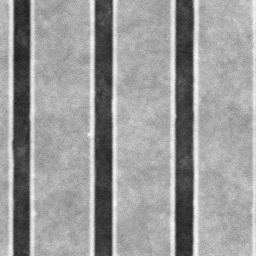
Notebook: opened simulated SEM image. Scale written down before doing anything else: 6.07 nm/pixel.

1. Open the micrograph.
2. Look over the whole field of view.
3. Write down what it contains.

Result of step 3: one or a few lines or trenches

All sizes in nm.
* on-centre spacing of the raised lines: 496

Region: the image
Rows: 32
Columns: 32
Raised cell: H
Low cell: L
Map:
HLLLHHHHHHHLLLHHHHHHHHLLLHHHHHHH
HLLLHHHHHHHLLLHHHHHHHHLLLHHHHHHH
HLLLHHHHHHHLLLHHHHHHHHLLLHHHHHHH
HLLLHHHHHHHLLLHHHHHHHHLLLHHHHHHH
HLLLHHHHHHHLLLHHHHHHHHLLLHHHHHHH
HLLLHHHHHHHLLLHHHHHHHHLLLHHHHHHH
HLLLHHHHHHHLLLHHHHHHHHLLLHHHHHHH
HLLLHHHHHHHLLLHHHHHHHHLLLHHHHHHH
HLLLHHHHHHHLLLHHHHHHHHLLLHHHHHHH
HLLLHHHHHHHLLLHHHHHHHHLLLHHHHHHH
HLLLHHHHHHHLLLHHHHHHHHLLLHHHHHHH
HLLLHHHHHHHLLLHHHHHHHHLLLHHHHHHH
HLLLHHHHHHHLLLHHHHHHHHLLLHHHHHHH
HLLLHHHHHHHLLLHHHHHHHHLLLHHHHHHH
HLLLHHHHHHHLLLHHHHHHHHLLLHHHHHHH
HLLLHHHHHHHLLLHHHHHHHHLLLHHHHHHH
HLLLHHHHHHHLLLHHHHHHHHLLLHHHHHHH
HLLLHHHHHHHLLLHHHHHHHHLLLHHHHHHH
HLLLHHHHHHHLLLHHHHHHHHLLLHHHHHHH
HLLLHHHHHHHLLLHHHHHHHHLLLHHHHHHH
HLLLHHHHHHHLLLHHHHHHHHLLLHHHHHHH
HLLLHHHHHHHLLLHHHHHHHHLLLHHHHHHH
HLLLHHHHHHHLLLHHHHHHHHLLLHHHHHHH
HLLLHHHHHHHLLLHHHHHHHHLLLHHHHHHH
HLLLHHHHHHHLLLHHHHHHHHLLLHHHHHHH
HLLLHHHHHHHLLLHHHHHHHHLLLHHHHHHH
HLLLHHHHHHHLLLHHHHHHHHLLLHHHHHHH
HLLLHHHHHHHLLLHHHHHHHHLLLHHHHHHH
HLLLHHHHHHHLLLHHHHHHHHLLLHHHHHHH
HLLLHHHHHHHLLLHHHHHHHHLLLHHHHHHH
HLLLHHHHHHHLLLHHHHHHHHLLLHHHHHHH
HLLLHHHHHHHLLLHHHHHHHHLLLHHHHHHH